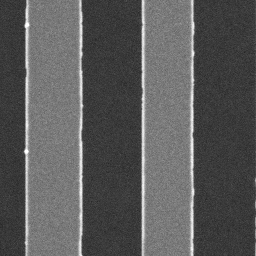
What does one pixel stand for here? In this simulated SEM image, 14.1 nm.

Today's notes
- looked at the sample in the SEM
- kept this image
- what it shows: lines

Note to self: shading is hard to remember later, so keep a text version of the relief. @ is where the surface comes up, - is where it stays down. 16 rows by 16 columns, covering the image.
--@@@----@@@----
--@@@----@@@----
--@@@----@@@----
--@@@----@@@----
--@@@----@@@----
--@@@----@@@----
--@@@----@@@----
--@@@----@@@----
--@@@----@@@----
--@@@----@@@----
--@@@----@@@----
--@@@----@@@----
--@@@----@@@----
--@@@----@@@----
--@@@----@@@----
--@@@----@@@----